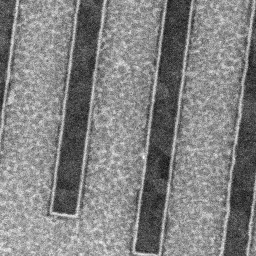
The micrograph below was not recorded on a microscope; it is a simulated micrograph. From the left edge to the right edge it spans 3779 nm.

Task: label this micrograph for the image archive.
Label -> one or a few lines or trenches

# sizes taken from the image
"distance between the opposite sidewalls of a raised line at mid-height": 26.5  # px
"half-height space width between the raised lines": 887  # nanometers